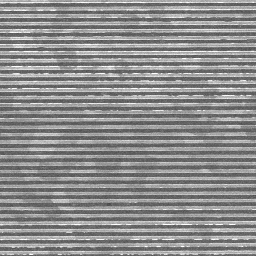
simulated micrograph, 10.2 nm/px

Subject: parallel lines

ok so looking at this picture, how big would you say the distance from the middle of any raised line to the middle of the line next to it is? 75.7 nanometres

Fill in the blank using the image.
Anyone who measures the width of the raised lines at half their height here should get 0.0307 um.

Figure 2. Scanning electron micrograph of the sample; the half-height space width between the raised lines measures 44.8 nm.